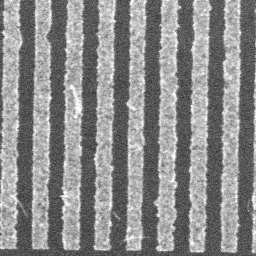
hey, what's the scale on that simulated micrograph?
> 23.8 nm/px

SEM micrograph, parallel lines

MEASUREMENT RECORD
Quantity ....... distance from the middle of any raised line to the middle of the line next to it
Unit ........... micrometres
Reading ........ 0.75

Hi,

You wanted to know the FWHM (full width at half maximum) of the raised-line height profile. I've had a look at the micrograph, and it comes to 344 nm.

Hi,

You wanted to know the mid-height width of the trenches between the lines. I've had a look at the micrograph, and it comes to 17 px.